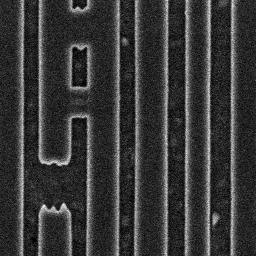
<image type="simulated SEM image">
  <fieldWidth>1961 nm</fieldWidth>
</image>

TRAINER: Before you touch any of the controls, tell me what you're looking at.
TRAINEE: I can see parallel lines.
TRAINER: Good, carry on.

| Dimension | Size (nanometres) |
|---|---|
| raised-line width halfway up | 243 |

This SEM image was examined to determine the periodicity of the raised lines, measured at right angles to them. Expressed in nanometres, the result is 363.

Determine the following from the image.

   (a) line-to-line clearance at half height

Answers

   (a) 129 nm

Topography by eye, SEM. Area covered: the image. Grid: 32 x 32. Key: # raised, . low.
###..####..####..####..###...###
###..##########..####..###...###
###..##########..####..###...###
###..##########..####..###...###
###..##########..####..###...###
###..##########..####..###...###
###..####..####..####..###...###
###..####..####..####..###...###
###..####..####..####..###...###
###..####..####..####..###...###
###..####..####..####..###...###
###..##########..####..###...###
###..##########..####..###...###
###..##########..####..###...###
###..##########..####..###...###
###..####..####..####..###...###
###..####..####..####..###...###
###..####..####..####..###...###
###..####..####..####..###...###
###..####..####..####..###...###
###....#...####..####..###...###
###........####..####..###...###
###........####..####..###...###
###........####..####..###...###
###........####..####..###...###
###........####..####..###...###
###..####..####..####..###...###
###..####..####..####..###...###
###..####..####..####..###...###
###..####..####..####..###...###
###..####..####..####..###...###
###..####..####..####..###...###